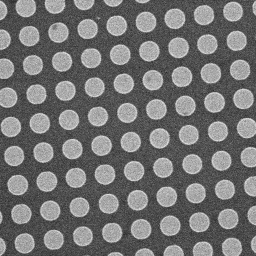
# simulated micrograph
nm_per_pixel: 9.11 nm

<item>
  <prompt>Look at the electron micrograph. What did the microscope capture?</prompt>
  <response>an array of small figures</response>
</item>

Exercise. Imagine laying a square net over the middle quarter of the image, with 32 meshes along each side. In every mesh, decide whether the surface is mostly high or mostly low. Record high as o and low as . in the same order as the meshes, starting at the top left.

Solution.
oo...ooo........................
o...........................ooo.
....................oooo...ooooo
.............oooo...ooooo..ooooo
o.....oooo...oooo...ooooo..ooooo
oo...ooooo...oooo...oooo.....o..
ooo..ooooo...oooo...............
ooo...ooo.......................
oo...........................ooo
......................ooo...oooo
..............ooo....oooo...oooo
.......ooo....oooo...ooooo..oooo
ooo...ooooo..ooooo...oooo....ooo
oooo..ooooo...oooo....oo........
oooo...ooo.....oo...............
ooo...........................oo
.......................oo....ooo
...............ooo....oooo...ooo
........ooo....oooo...oooo...ooo
oooo...ooooo..ooooo...oooo....oo
oooo...ooooo..ooooo...ooo.......
oooo...ooooo...ooo..............
oooo....ooo.....................
.oo...........................oo
.................o.....oooo...oo
.........oo....ooooo..ooooo...oo
..oo....oooo...ooooo...oooo...oo
.oooo...ooooo..ooooo...oooo.....
.oooo...ooooo...ooo.............
.oooo....ooo....................
..oo...........................o
........................ooo....o